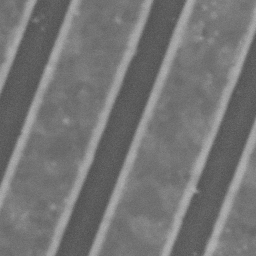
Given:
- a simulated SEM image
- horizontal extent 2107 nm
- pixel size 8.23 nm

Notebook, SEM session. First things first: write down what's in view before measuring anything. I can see one or a few lines or trenches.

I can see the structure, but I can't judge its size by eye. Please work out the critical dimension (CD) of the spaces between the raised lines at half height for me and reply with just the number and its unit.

313 nm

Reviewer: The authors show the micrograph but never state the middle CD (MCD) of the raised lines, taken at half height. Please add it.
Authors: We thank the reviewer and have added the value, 0.572 µm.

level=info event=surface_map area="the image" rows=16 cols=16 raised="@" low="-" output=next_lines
@@--@@@@@---@@@@
@---@@@@@--@@@@@
@---@@@@---@@@@@
@--@@@@@---@@@@-
---@@@@@--@@@@@-
---@@@@---@@@@--
--@@@@@--@@@@@--
--@@@@@--@@@@@--
-@@@@@---@@@@---
-@@@@@--@@@@@--@
-@@@@---@@@@---@
@@@@@--@@@@@---@
@@@@@--@@@@@--@@
@@@@---@@@@---@@
@@@@--@@@@@--@@@
@@@---@@@@@--@@@